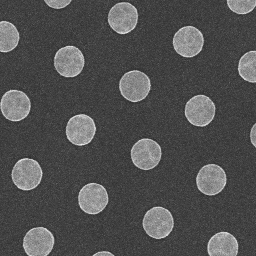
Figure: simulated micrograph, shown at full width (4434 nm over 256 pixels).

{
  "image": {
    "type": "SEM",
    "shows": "a regular array of raised bodies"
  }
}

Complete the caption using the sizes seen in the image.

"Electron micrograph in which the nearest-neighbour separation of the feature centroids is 1200 nm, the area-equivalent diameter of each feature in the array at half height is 527 nanometres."